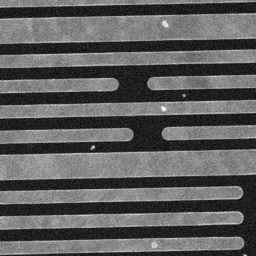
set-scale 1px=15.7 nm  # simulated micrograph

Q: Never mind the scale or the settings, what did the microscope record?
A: groups of lines, slits or small figures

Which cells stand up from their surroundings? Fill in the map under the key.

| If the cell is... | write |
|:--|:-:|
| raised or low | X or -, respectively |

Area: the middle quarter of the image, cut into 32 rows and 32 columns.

--------------------------------
--------------------------------
--------------------------------
----------------------XXXXXXXXXX
XXXXXXXXXXXXX--------XXXXXXXXXXX
XXXXXXXXXXXXX--------XXXXXXXXXXX
XXXXXXXXXXXXX-------------------
--------------------------------
--------------------------------
--------------------------------
XXXXXXXXXXXXXXXXXXXXXXXXXXXXXXXX
XXXXXXXXXXXXXXXXXXXXXXXXXXXXXXXX
XXXXXXXXXXXXXXXXXXXXXXXXXX------
--------------------------------
--------------------------------
--------------------------------
---XXXXXXXXXXXXXX--------XXXXXXX
XXXXXXXXXXXXXXXXX--------XXXXXXX
XXXXXXXXXXXXXXXXX--------XXXXXXX
--------------------------------
--------------------------------
--------------------------------
----XXXXXXXXXXXXXXXXXXXXXXXXXXXX
XXXXXXXXXXXXXXXXXXXXXXXXXXXXXXXX
XXXXXXXXXXXXXXXXXXXXXXXXXXXXXXXX
XXXXXXXXXXXXXXXXXXXXXXXXXXXXXXXX
XXXXXXXXXXXXXXXXXXXXXXXXXXXXXXXX
XXXXXXXXXXXXXXXXXXXXXXXXXXXXXXXX
--------------------------------
--------------------------------
--------------------------------
-----------XXXXXXXXXXXXXXXXXXXXX